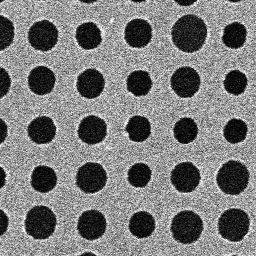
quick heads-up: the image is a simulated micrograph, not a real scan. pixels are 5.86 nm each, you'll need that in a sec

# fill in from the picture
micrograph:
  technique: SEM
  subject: a regular array of holes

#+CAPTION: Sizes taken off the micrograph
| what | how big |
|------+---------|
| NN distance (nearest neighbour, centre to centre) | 0.27 µm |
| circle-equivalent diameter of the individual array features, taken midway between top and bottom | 170 nanometers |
